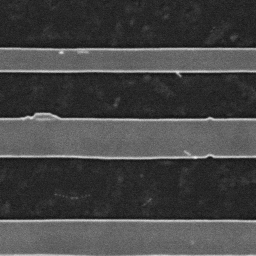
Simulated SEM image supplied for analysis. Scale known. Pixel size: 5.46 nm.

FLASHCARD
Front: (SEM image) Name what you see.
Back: one or a few lines or trenches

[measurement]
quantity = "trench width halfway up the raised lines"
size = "298 nm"